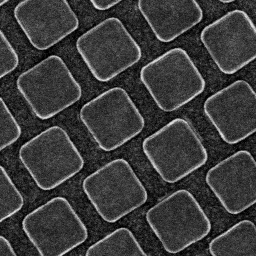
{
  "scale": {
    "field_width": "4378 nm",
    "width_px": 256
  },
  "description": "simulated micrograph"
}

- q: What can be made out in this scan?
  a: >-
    a regular array of raised bodies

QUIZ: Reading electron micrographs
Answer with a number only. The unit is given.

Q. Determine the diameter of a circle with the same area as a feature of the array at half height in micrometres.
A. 0.972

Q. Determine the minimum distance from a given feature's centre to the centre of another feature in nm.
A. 1200